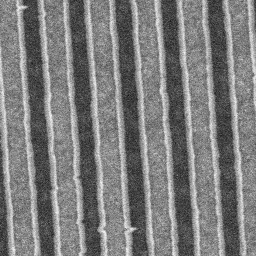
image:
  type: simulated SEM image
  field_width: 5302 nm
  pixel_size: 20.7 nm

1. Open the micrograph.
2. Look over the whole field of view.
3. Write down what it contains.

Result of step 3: parallel lines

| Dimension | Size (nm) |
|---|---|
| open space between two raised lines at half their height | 436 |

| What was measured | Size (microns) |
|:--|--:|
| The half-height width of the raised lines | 0.514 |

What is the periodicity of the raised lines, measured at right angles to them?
956 nanometers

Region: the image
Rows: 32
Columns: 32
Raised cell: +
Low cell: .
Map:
++...+++...+++...+++..++++..+++.
+++..+++...+++...+++..++++..+++.
+++..+++...+++...+++...+++..+++.
+++..+++...+++...+++...+++...++.
+++..++++..+++...+++...+++...+++
+++..++++..+++...+++...+++...+++
+++...+++..+++...+++...+++...+++
+++...+++..+++...+++...+++...+++
+++...+++...+++..+++...+++...+++
+++...+++...+++..+++...+++...+++
+++...+++...+++..+++...+++...+++
+++...+++...+++...++...+++...+++
+++...+++...+++...+++..+++...+++
+++...+++...+++...+++..++++..+++
+++...+++...+++...+++...+++..+++
+++...+++...+++...+++...+++..+++
+++...+++...+++...+++...+++..+++
++++..+++...+++...+++...+++...++
.+++..++++..+++...+++...+++...++
.+++..++++..+++...+++...+++...++
.+++...+++..+++...+++...+++...++
.+++...+++..+++...+++...+++...++
.+++...+++...+++..+++...+++...++
.+++...+++...+++..+++...+++...++
.+++...+++..++++..+++...+++...++
.+++...+++...+++..+++...+++...++
.+++...+++...+++...+++..+++...++
.+++...+++...+++...+++..+++...++
.+++...+++...+++...+++...++...++
.++++..+++...+++...+++...+++..++
.++++..+++...+++...+++...+++..++
.++++..+++...+++...+++...+++..++